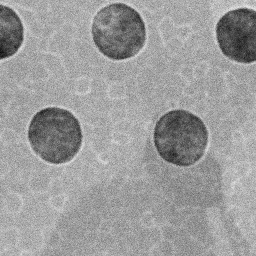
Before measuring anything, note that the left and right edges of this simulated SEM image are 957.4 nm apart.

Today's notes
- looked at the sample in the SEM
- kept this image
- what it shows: holes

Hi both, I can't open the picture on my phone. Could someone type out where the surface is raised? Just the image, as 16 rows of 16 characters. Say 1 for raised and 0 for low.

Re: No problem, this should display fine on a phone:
0111110011111110
0111110001111100
0111110001111100
0111111011111100
1111111111111111
1111111111111111
1111111111111111
1100011111000111
1100011111000111
1100011111000111
1111111111111111
1111111111111111
1111111111111111
1111111111111111
1111111111111111
1111111111111111